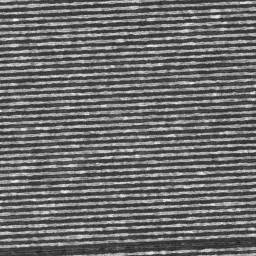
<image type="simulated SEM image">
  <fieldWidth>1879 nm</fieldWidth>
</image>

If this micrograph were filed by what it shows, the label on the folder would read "parallel lines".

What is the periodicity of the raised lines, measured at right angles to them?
47.5 nm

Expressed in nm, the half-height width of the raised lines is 14.7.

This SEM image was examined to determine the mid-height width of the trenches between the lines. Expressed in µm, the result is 0.0321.